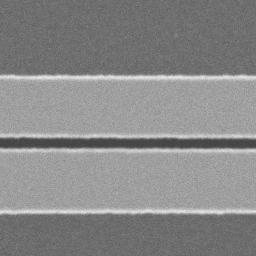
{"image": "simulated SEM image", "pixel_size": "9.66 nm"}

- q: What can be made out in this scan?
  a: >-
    lines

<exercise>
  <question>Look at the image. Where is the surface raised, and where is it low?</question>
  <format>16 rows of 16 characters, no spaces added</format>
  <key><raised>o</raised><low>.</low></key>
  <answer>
................
................
................
................
................
oooooooooooooooo
oooooooooooooooo
oooooooooooooooo
oooooooooooooooo
oooooooooooooooo
oooooooooooooooo
oooooooooooooooo
oooooooooooooooo
................
................
................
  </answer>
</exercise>